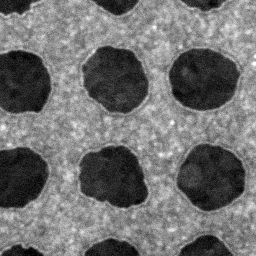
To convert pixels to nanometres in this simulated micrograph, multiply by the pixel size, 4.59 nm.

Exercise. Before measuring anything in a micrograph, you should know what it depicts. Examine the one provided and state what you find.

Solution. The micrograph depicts raised bodies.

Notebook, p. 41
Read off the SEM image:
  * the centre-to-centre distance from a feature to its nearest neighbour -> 426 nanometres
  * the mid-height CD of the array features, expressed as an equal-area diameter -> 0.315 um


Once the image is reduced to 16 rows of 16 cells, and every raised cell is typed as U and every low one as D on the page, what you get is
UUDDDDUUDDDDUUDD
DDDDDDDDDDDDDDDD
DDDDDDDDDDDDDDDD
UUDDDDUUUDDUUUDD
UUUDDUUUUDDUUUUD
UUUDDUUUUDDUUUUD
UUUDDDUUUDDUUUDD
DDDDDDDDDDDDDDDD
DDDDDDDDDDDDDDDD
UUDDDDUUDDDDUUUD
UUUDDUUUUDDUUUUD
UUUDDUUUUDDUUUUD
UUDDDDUUUDDDUUUD
DDDDDDDDDDDDDDDD
DDDDDDDDDDDDDDDD
UUDDDDUUDDDUUUDD